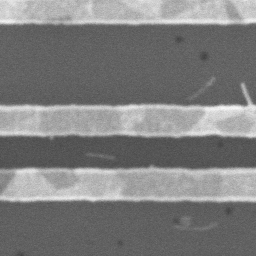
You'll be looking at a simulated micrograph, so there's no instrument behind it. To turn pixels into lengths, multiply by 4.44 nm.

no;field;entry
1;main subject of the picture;lines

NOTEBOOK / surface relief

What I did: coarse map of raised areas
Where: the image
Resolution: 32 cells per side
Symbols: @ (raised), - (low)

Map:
@@@@@@@@@@@@@@@@@@@@@@@@@@@@@@@@
@@@@@@@@@@@@@@@@@@@@@@@@@@@@@@@@
@@@@@@@@@@@@@@@@@@@@@@@@@@@@@@@@
--------------------------------
--------------------------------
--------------------------------
--------------------------------
--------------------------------
--------------------------------
--------------------------------
--------------------------------
--------------------------------
--------------------------------
@@@@@@@@@@@@@@@@@@@@@@@@@@@@@@@@
@@@@@@@@@@@@@@@@@@@@@@@@@@@@@@@@
@@@@@@@@@@@@@@@@@@@@@@@@@@@@@@@@
@@@@@@@@@@@@@@@@@@@@@@@@@@@@@@@@
--------------------------------
--------------------------------
--------------------------------
--------------------------------
@@@@@@@@@@@@@@@@@@@@@@@@@@@@@@@@
@@@@@@@@@@@@@@@@@@@@@@@@@@@@@@@@
@@@@@@@@@@@@@@@@@@@@@@@@@@@@@@@@
@@@@@@@@@@@@@@@@@@@@@@@@@@@@@@@@
--------------------------------
--------------------------------
--------------------------------
--------------------------------
--------------------------------
--------------------------------
--------------------------------